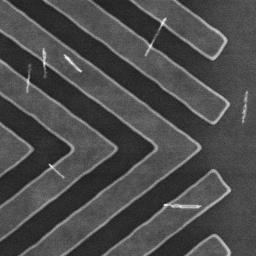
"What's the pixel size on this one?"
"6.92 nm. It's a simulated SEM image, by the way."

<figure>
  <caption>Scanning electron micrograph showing groups of lines, slits or small figures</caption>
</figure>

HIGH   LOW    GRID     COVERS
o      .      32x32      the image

o.....oooooo.....oooooo.........
ooo.....ooooo.....oooooo........
oooo.....oooooo.....ooooo.......
ooooo.....oooooo.....oooooo.....
.oooooo.....ooooo.....oooooo....
..oooooo.....oooooo.....oooo....
....ooooo.....oooooo.....oo.....
.....oooooo.....ooooo...........
o.....oooooo.....oooooo.........
ooo.....ooooo.....oooooo........
oooo.....oooooo.....ooooo.......
ooooo.....oooooo.....oooooo.....
.oooooo.....ooooo.....oooooo....
..oooooo.....oooooo.....oooo....
....ooooo......ooooo.....ooo....
.....oooooo.....ooooo...........
oo....oooooo.....oooooo.........
ooo.....ooooo.....oooooo........
oooo.....ooooo.....oooooo.......
ooo.....oooooo....oooooo........
oo.....ooooo.....oooooo.........
o.....ooooo.....oooooo....o.....
....oooooo.....ooooo.....ooo....
...oooooo....oooooo.....ooooo...
..ooooo.....oooooo....oooooo....
oooooo.....ooooo.....oooooo.....
ooooo....oooooo.....ooooo.......
ooo.....oooooo.....ooooo........
oo.....ooooo.....oooooo.........
o.....ooooo.....ooooo.....o.....
....oooooo.....ooooo.....ooo....
...oooooo....oooooo.....ooooo...